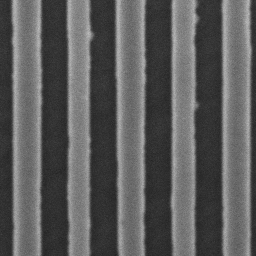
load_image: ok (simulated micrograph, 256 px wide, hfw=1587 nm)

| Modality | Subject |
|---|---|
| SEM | lines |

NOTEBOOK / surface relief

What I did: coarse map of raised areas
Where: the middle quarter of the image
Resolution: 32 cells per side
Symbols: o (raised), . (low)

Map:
.ooooo.......ooooooo.......ooooo
.ooooo.......ooooooo.......ooooo
.ooooo.......ooooooo.......ooooo
.ooooo.......ooooooo.......ooooo
.ooooo.......ooooooo.......ooooo
.ooooo.......ooooooo.......ooooo
.ooooo.......ooooooo.......ooooo
.ooooo.......ooooooo.......ooooo
.ooooo.......ooooooo.......ooooo
.ooooo.......ooooooo.......ooooo
.ooooo.......ooooooo.......ooooo
.ooooo........oooooo.......ooooo
.ooooo........oooooo.......ooooo
.ooooo.......ooooooo.......ooooo
.ooooo........oooooo.......ooooo
.ooooo........oooooo.......ooooo
.ooooo........oooooo.......ooooo
.ooooo.......ooooooo.......ooooo
.ooooo.......ooooooo.......ooooo
.ooooo.......ooooooo.......ooooo
.ooooo........oooooo.......ooooo
.ooooo........oooooo.......ooooo
.ooooo........oooooo.......ooooo
.ooooo........oooooo.......ooooo
.ooooo........oooooo.......ooooo
.ooooo........oooooo.......ooooo
.ooooo........oooooo.......ooooo
.ooooo........oooooo.......ooooo
.ooooo........oooooo.......ooooo
.ooooo........oooooo.......ooooo
.ooooo........oooooo.......ooooo
.ooooo........oooooo.......ooooo